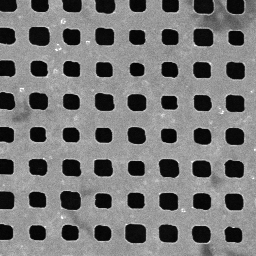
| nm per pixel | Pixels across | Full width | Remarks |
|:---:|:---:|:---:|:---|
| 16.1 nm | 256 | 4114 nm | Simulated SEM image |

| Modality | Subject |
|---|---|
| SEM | a regular array of holes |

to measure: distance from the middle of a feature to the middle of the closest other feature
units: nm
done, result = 518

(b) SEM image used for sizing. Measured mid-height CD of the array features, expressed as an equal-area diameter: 293 nanometres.